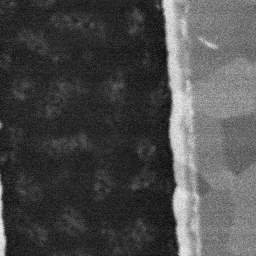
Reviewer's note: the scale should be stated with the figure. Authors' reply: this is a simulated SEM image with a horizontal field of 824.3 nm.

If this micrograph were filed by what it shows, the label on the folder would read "one or a few lines or trenches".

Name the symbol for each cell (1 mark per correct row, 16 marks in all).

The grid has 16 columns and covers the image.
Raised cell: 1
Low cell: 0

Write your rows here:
0000000000011111
0000000000011111
0000000000011111
0000000000011111
0000000000011111
0000000000011111
0000000000011111
0000000000011111
0000000000011111
0000000000011111
0000000000011111
0000000000011111
0000000000011111
0000000000011111
0000000000011111
0000000000001111